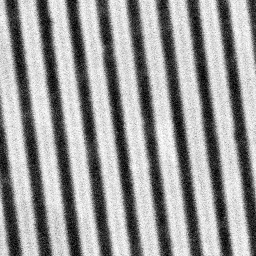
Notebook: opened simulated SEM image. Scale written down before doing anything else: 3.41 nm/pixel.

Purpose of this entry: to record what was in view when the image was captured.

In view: parallel lines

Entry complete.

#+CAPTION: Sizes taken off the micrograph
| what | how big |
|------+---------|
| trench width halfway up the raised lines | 48.2 nanometres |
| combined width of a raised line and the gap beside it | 0.102 micrometres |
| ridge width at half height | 15.9 pixels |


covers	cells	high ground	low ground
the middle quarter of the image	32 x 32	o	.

oo....oooo....ooo....oooo....ooo
oo....oooo....ooo....oooo....ooo
ooo...oooo....oooo...oooo....ooo
ooo...oooo....oooo...oooo....ooo
ooo....ooo....oooo....ooo....ooo
ooo....ooo....oooo....oooo...ooo
ooo....oooo...oooo....oooo...ooo
ooo....oooo...oooo....oooo....oo
ooo....oooo....ooo....oooo....oo
ooo....oooo....oooo...oooo....oo
oooo...oooo....oooo...oooo....oo
oooo...oooo....oooo....ooo....oo
oooo....ooo....oooo....oooo...oo
oooo....oooo...oooo....oooo...oo
.ooo....oooo...oooo....oooo...oo
.ooo....oooo....ooo....oooo....o
.ooo....oooo....oooo...oooo....o
.oooo...oooo....oooo...oooo....o
.oooo...oooo....oooo...oooo....o
.oooo....ooo....oooo....ooo....o
.oooo....oooo...oooo....oooo...o
.oooo....oooo...oooo....oooo...o
..ooo....oooo...oooo....oooo....
..ooo....oooo....ooo....oooo....
..oooo...oooo....oooo...oooo....
..oooo...oooo....oooo...oooo....
..oooo....oooo...oooo....ooo....
..oooo....oooo...oooo....oooo...
..oooo....oooo...oooo....oooo...
..oooo....oooo...oooo....oooo...
..oooo....oooo....ooo....oooo...
...ooo....oooo....oooo...oooo...